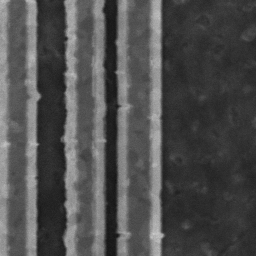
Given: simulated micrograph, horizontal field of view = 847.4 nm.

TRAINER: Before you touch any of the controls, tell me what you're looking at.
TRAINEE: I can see one or a few lines or trenches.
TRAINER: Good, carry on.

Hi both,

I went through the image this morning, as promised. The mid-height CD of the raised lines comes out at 102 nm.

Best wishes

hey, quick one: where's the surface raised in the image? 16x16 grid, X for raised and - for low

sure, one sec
XX--XX--XX------
XX--XX--XX------
XX--XX--XX------
XX--XX--XX------
XX--XX--XX------
XX--XX--XX------
XX--XX--XX------
XX--XX--XX------
XX--XX--XX------
XX--XX--XX------
XX--XX--XX------
XX--XX--XX------
XX--XX--XX------
XX--XX--XX------
XX--XX--XX------
XX--XX--XX------